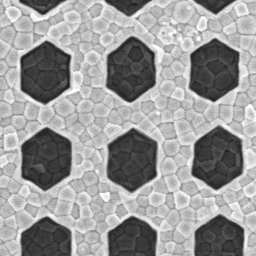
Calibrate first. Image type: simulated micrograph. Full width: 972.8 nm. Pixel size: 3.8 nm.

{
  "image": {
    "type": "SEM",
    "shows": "holes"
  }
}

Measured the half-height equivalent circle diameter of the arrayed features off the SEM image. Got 211 nanometers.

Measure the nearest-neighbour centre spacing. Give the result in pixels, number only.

85.7